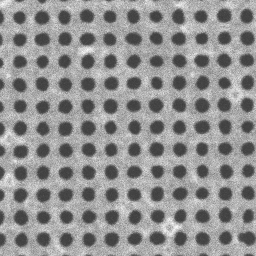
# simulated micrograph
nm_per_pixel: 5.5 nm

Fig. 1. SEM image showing a regular array of holes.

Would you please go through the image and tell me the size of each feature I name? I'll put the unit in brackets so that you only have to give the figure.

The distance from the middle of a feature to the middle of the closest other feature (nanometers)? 120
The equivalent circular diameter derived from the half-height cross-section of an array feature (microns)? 0.0762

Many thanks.